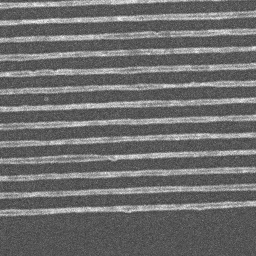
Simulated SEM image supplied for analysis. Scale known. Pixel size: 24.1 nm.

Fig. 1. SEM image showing parallel lines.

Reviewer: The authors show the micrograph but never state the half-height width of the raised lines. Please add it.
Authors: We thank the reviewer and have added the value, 106 nanometers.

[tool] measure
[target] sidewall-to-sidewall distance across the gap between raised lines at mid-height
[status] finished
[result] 310 nanometers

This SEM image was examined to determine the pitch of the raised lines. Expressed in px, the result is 17.2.